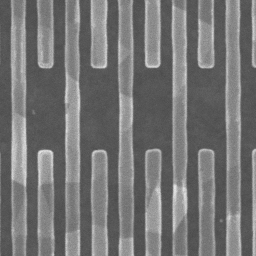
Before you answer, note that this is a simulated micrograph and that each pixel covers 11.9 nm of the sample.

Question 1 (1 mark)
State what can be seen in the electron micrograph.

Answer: wiring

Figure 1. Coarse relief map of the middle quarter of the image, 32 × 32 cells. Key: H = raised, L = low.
HHHHLLLHHHLLLLHHHLLLLHHLLLLHHHLL
LHHHLLLLLLLLLLHHHLLLLLLLLLLHHHLL
LHHHLLLLLLLLLLHHHLLLLLLLLLLHHHLL
LHHLLLLLLLLLLLHHHLLLLLLLLLLHHHLL
LHHLLLLLLLLLLLHHHLLLLLLLLLLHHHLL
LHHLLLLLLLLLLLHHHLLLLLLLLLLHHHLL
LHHHLLLLLLLLLLHHHLLLLLLLLLLHHHLL
LHHHLLLLLLLLLLHHHLLLLLLLLLLHHHLL
HHHHLLLLLLLLLLHHHLLLLLLLLLLHHHLL
HHHHLLLLLLLLLLHHHLLLLLLLLLLHHHLL
LHHHLLLLLLLLLLHHHLLLLLLLLLLHHHLL
LHHHLLLLLLLLLLHHHLLLLLLLLLLHHHLL
LHHHLLLLLLLLLLHHHLLLLLLLLLLHHHLL
LHHHLLLLLLLLLLHHHLLLLLLLLLLHHHLL
LHHHLLLLLLLLLLHHHLLLLLLLLLLHHHLL
LHHHLLLLLLLLLLHHHLLLLLLLLLLHHHLL
LHHHLLLLLLLLLLHHHLLLLLLLLLLHHHLL
LHHHLLLLLLLLLLHHHLLLLLLLLLLHHHLL
LHHHLLLLLLLLLLHHHLLLLLLLLLLHHHLL
LHHHLLLLLLLLLLHHHLLLLLLLLLLHHHHL
LHHHLLLLLLLLLLHHHLLLLLLLLLLHHHHL
LHHHLLLLLLLLLLHHHLLLLLHHLLLHHHHL
LHHHLLLHHHLLLLHHHLLLLHHHLLLHHHHL
LHHHLLLHHHHLLLHHHLLLLHHHLLLHHHHL
LHHHLLLHHHHLLLHHHLLLLHHHLLLHHHHL
LHHHLLLHHHHLLLHHHLLLLHHHLLLHHHLL
LHHHLLLHHHHLLLHHHLLLLHHHLLLLHHLL
LHHHLLLHHHHLLLHHHLLLLHHHLLLLHHLL
LHHHLLLHHHHLLLHHHLLLLHHHLLLLHHLL
LHHHLLLHHHHLLLHHHLLLLHHHLLLLHHLL
LHHHLLLHHHHLLLHHHLLLLHHHLLLLHHLL
LHHHLLLHHHHLLLHHHLLLLHHHLLLLHHLL